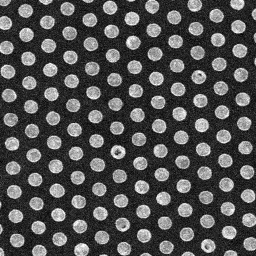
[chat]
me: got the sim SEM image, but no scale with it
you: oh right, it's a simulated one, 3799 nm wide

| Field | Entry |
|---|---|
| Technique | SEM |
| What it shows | a regular array of raised bodies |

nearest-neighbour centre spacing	0.354	microns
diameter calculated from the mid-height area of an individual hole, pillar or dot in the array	0.196	um